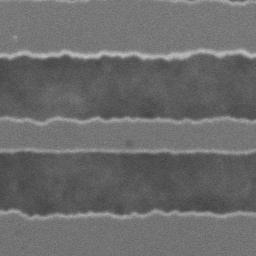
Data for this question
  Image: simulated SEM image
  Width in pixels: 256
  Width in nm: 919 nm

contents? lines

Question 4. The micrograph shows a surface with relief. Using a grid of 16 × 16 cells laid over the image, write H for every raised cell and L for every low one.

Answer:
HHHHHHHHHHHHHHHH
HHHHHHHHHHHHHHHH
HHHHHHHHHHHHHHHH
HLHHHHHHHHHLLLLL
LLLLLLLLLLLLLLLL
LLLLLLLLLLLLLLLL
LLLLLLLLLLLLLLLL
HHLHHHHHHHHLLHHL
HHHHHHHHHHHHHHHH
LLLHLLLHHHHHHHHH
LLLLLLLLLLLLLLLL
LLLLLLLLLLLLLLLL
LLLLLLLLLLLLLLLL
HHLHHHHHHHHHHHHH
HHHHHHHHHHHHHHHH
HHHHHHHHHHHHHHHH